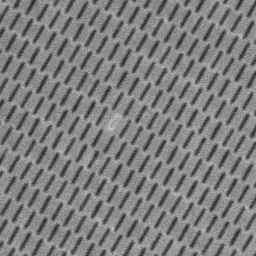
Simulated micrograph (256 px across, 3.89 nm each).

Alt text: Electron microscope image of a regular array of holes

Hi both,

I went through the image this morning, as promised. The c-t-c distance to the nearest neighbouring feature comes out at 52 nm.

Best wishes